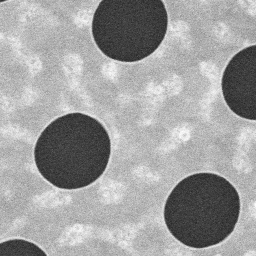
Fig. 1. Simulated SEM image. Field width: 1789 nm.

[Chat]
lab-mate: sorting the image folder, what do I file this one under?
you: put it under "holes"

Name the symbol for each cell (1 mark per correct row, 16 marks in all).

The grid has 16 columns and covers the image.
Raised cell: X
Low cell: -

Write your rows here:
XXXXXX----XXXXXX
XXXXXX----XXXXXX
XXXXXX----XXXXXX
XXXXXXX--XXXXXX-
XXXXXXXXXXXXXX--
XXXXXXXXXXXXXX--
XXXXXXXXXXXXXX--
XXX---XXXXXXXXXX
XXX----XXXXXXXXX
XX-----XXXXXXXXX
XX-----XXXXXXXXX
XXX---XXXXX---XX
XXXXXXXXXX-----X
XXXXXXXXXX-----X
XXXXXXXXXXX---XX
--XXXXXXXXXXXXXX